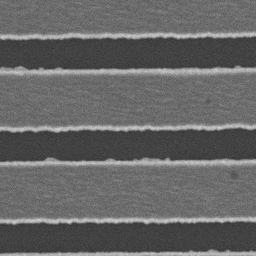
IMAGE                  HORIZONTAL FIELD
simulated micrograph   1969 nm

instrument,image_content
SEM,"lines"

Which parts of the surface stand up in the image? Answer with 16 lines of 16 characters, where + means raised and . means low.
++++++++++++++++
++++++++++++++++
................
................
++++++++++++++++
++++++++++++++++
++++++++++++++++
++++++++++++++++
................
................
++++++++++++++++
++++++++++++++++
++++++++++++++++
++++++++++++++++
................
................